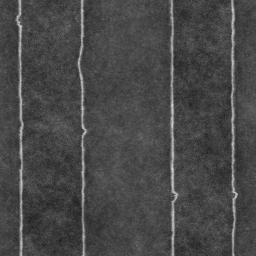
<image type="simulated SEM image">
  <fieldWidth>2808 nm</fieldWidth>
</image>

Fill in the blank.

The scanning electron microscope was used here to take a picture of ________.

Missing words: one or a few lines or trenches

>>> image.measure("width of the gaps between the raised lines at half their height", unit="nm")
986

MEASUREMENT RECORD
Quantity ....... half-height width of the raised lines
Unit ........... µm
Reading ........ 0.668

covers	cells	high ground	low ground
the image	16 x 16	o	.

.oooo......oooo.
.oooo......oooo.
.oooo......oooo.
.oooo......oooo.
.oooo......oooo.
.oooo......oooo.
.oooo......oooo.
.oooo......oooo.
.oooo......oooo.
.oooo......oooo.
.oooo......oooo.
.oooo......oooo.
.oooo......oooo.
.oooo......oooo.
.oooo......oooo.
.oooo......oooo.